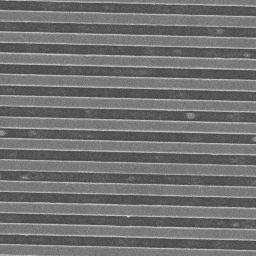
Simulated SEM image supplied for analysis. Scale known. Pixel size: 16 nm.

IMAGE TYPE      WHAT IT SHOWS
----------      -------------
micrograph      parallel lines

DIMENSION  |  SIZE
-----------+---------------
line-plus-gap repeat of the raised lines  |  21.3 px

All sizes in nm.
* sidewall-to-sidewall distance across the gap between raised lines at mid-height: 164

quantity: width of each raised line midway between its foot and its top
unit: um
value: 0.164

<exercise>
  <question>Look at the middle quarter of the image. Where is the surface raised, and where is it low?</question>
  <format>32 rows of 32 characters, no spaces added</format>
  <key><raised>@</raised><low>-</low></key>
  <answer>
----------------@@@@@@@@@@@@@@@@
--------------------------------
--------------------------------
@@@@@@@@@@@@@@@@@---@@----------
@@@@@@@@@@@@@@@@@@@@@@@@@@@@@@@@
--@@@@@@@@@@@@@@@@@@@@@@@@@@@@@@
--------------------------------
--------------------------------
@@@@@@@@@@@---------------------
@@@@@@@@@@@@@@@@@@@@@@@@@@@@@@@@
@@@@@@@@@@@@@@@@@@@@@@@@@@@@@@@@
----------------------------@@@@
-------------------------------@
--------------------------------
@@@@@@@@@@@@@@@@@@@@@@@@@@@-----
@@@@@@@@@@@@@@@@@@@@@@@@@@@@@@@@
--------------@@@@@@@@@@@@@@@@@@
--------------------------------
--------------------------------
@@@@@@@@@@@@@@@@@@@@@@----------
@@@@@@@@@@@@@@@@@@@@@@@@@@@@@@@@
@@@@@@@@@@@@@@@@@@@@@@@@@@@@@@@@
--------------------------------
--------------------------------
@@@@@@@@------------------------
@@@@@@@@@@@@@@@@@@@@@@@@@@@@@@@@
@@@@@@@@@@@@@@@@@@@@@@@@@@@@@@@@
--------------------------@@@@@@
--------------------------------
--------------------------------
@@@@@@@@@@@@@@@@@@@@@@@@@@@@@@@@
@@@@@@@@@@@@@@@@@@@@@@@@@@@@@@@@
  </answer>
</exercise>